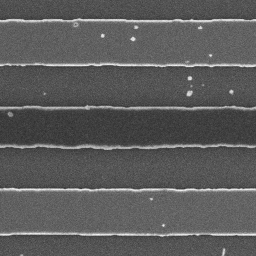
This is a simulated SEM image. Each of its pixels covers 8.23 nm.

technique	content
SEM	lines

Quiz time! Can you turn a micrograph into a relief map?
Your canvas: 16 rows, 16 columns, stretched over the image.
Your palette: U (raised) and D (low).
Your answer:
DDDDDDDDDDDDDDDD
UUUUUUUUUUUUUUUU
UUUUUUUUUUUUUUUU
UUUUUUUUUUUUUUUU
DDDDDDDDDDDDDDDD
DDDDDDDDDDDDDDDD
DDDDDDDDDDDDDDDD
UUUUUUUUUUUUUUUU
UUUUUUUUUUUUUUUU
DDDDDDDDDDDDDDDD
DDDDDDDDDDDDDDDD
DDDDDDDDDDDDDDDD
UUUUUUUUUUUUUUUU
UUUUUUUUUUUUUUUU
UUUUUUUUUUUUUUUU
DDDDDDDDDDDDDDDD